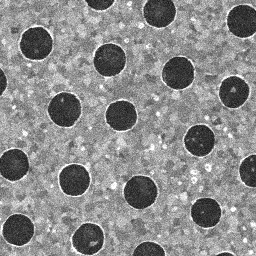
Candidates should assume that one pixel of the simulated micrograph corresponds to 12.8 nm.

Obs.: a regular array of holes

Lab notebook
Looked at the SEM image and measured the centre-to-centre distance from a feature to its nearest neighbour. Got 756 nm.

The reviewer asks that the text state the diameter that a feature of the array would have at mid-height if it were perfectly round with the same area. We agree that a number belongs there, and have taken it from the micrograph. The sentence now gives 415 nanometres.